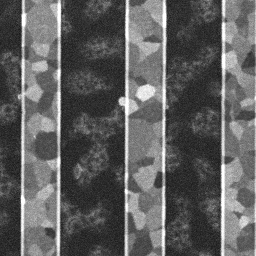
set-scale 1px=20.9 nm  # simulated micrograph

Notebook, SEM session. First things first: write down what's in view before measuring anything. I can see one or a few lines or trenches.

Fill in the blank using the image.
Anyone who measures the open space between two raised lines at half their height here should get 1340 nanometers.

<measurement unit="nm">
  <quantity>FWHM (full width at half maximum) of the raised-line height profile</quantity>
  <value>760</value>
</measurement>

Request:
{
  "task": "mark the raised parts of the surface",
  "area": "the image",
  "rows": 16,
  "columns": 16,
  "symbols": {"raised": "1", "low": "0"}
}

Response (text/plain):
0111000011000011
0111000011000011
0111000011000011
0111000011000011
0111000011000011
0111000011000011
0111000011000011
0111000011000011
0111000011000011
0111000011000011
0111000011000011
0111000011000011
0111000011000011
0111000011000011
0111000011000011
0111000011000011